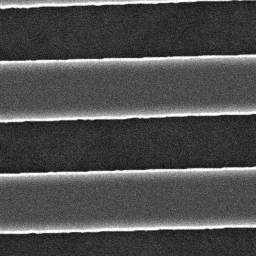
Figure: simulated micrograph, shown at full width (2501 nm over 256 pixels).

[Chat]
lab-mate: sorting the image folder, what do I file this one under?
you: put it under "lines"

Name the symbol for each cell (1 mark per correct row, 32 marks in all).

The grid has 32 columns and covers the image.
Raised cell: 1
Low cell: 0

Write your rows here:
11111111111111000000000000000000
00000000000000000000000000000000
00000000000000000000000000000000
00000000000000000000000000000000
00000000000000000000000000000000
00000000000000000000000000000000
00000000000000000000000000000000
00000000011111111111111111111111
11111111111111111111111111111111
11111111111111111111111111111111
11111111111111111111111111111111
11111111111111111111111111111111
11111111111111111111111111111111
11111111111111111111111111111111
11111111111111111111100000000000
00000000000000000000000000000000
00000000000000000000000000000000
00000000000000000000000000000000
00000000000000000000000000000000
00000000000000000000000000000000
00000000000000000000000000000000
00000000000011111111111111111111
11111111111111111111111111111111
11111111111111111111111111111111
11111111111111111111111111111111
11111111111111111111111111111111
11111111111111111111111111111111
11111111111111111111111111111111
11111111111111111111111110000000
00000000000000000000000000000000
00000000000000000000000000000000
00000000000000000000000000000000